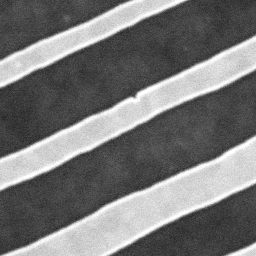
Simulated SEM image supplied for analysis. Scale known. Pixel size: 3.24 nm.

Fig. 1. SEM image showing one or a few lines or trenches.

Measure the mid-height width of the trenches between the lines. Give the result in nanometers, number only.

212